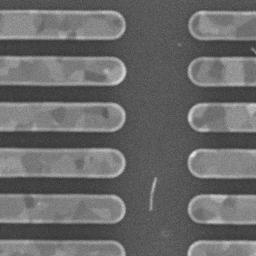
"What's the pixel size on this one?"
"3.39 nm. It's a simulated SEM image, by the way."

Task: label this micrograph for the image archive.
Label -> groups of lines, slits or small figures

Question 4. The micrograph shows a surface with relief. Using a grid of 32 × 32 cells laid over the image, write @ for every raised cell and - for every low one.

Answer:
--------------------------------
@@@@@@@@@@--@@------------------
@@@@@@@@@@@@@@@---------@@@@@@@@
@@@@@@@@@@@@@@@---------@@@@@@@@
@@@@@@@@@@@@@@@---------@@@@@@@@
--------------------------------
--------------------------------
@@@@@@@@@@@@@@@---------@@@@@@@@
@@@@@@@@@@@@@@@@--------@@@@@@@@
@@@@@@@@@@@@@@@---------@@@@@@@@
-----@@@-----------------@@@@@@@
--------------------------------
--------------------------------
@@@@@@@@@@@@@@@---------@@@@@@@@
@@@@@@@@@@@@@@@---------@@@@@@@@
@@@@@@@@@@@@@@@---------@@@@@@@@
--------------------------------
--------------------------------
--------------------------------
@@@@@@@@@@@@@@@---------@@@@@@@@
@@@@@@@@@@@@@@@---------@@@@@@@@
@@@@@@@@@@@@@@@---------@@@@@@@@
--------------------------------
--------------------------------
@@@@@@@@@@@@-------------@@@----
@@@@@@@@@@@@@@@---------@@@@@@@@
@@@@@@@@@@@@@@@---------@@@@@@@@
@@@@@@@@@@@@@@@---------@@@@@@@@
--------------------------------
--------------------------------
@@@@@@@@@@@@@@@---------@@@@@@@@
@@@@@@@@@@@@@@@---------@@@@@@@@